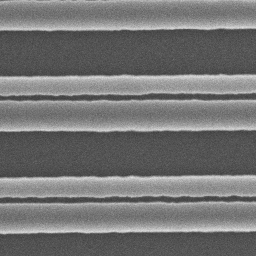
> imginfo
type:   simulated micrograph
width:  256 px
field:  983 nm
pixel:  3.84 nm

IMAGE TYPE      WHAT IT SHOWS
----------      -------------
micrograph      lines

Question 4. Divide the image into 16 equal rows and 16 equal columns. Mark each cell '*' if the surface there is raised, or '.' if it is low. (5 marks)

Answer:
****************
****************
................
................
................
****************
****************
****************
................
................
................
****************
****************
****************
****.*..........
................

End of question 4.